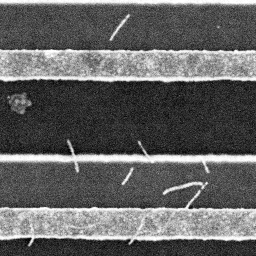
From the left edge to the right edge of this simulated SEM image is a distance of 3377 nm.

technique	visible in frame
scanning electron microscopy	lines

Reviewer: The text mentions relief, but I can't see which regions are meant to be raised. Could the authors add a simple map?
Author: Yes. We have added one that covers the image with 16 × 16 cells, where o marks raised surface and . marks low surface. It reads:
oooooooooooooooo
oooooooooooooooo
oooooooooooooooo
oooooooooooooooo
oooooooooooooooo
................
................
................
................
................
oooooooooooooooo
oooooooooooooooo
oooooooooooooooo
oooooooooooooooo
oooooooooooooooo
................